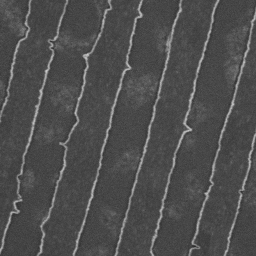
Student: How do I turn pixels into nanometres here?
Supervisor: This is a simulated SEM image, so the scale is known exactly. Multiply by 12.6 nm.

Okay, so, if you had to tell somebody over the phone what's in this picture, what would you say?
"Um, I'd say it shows one or a few lines or trenches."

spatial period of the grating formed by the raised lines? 914 nm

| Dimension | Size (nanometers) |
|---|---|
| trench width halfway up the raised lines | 485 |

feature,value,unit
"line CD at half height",429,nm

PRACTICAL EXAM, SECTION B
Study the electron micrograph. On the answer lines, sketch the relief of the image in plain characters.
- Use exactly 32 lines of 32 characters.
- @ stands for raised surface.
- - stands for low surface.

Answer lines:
----@@@@------@@@@-----@@@@-----
----@@@@-----@@@@@----@@@@@-----
---@@@@@-----@@@@-----@@@@@-----
---@@@@------@@@@-----@@@@-----@
---@@@@-----@@@@@----@@@@@-----@
--@@@@------@@@@-----@@@@@-----@
--@@@@@----@@@@@-----@@@@------@
--@@@@-----@@@@@-----@@@@-----@@
-@@@@@-----@@@@@-----@@@@----@@@
-@@@@@-----@@@@-----@@@@@-----@@
-@@@@-----@@@@@-----@@@@------@@
-@@@@-----@@@@@-----@@@@-----@@@
-@@@@-----@@@@------@@@@-----@@@
@@@@@-----@@@@-----@@@@@-----@@@
@@@@------@@@@-----@@@@-----@@@@
@@@@-----@@@@@-----@@@@-----@@@@
@@@@-----@@@@------@@@@-----@@@@
@@@@----@@@@@-----@@@@@----@@@@@
@@@-----@@@@@-----@@@@-----@@@@@
@@@-----@@@@@-----@@@@-----@@@@-
@@@-----@@@@@-----@@@@-----@@@@-
@@@-----@@@@-----@@@@------@@@@-
@@-----@@@@@-----@@@@-----@@@@@-
@@-----@@@@@-----@@@@-----@@@@--
@@-----@@@@@----@@@@@-----@@@@--
@@-----@@@@-----@@@@-----@@@@@--
@@----@@@@@-----@@@@-----@@@@@--
@-----@@@@@-----@@@@-----@@@@---
@----@@@@@-----@@@@@-----@@@@---
@----@@@@@-----@@@@-----@@@@@---
-----@@@@@-----@@@@-----@@@@@---
-----@@@@------@@@@-----@@@@----